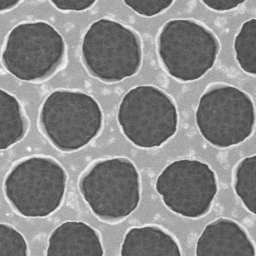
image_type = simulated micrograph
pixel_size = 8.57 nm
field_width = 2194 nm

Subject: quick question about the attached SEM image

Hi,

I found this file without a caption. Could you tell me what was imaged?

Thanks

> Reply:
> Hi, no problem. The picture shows a regular array of holes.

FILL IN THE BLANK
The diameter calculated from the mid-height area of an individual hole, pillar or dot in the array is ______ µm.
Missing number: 0.511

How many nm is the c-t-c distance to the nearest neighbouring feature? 644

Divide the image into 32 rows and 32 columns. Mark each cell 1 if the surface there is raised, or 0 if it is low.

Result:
00111110000011110000011111000011
11111111111111111000111111111111
11111111111111111111110111111110
11000001111000001111000001111100
10000000111000000111000000011100
10000000110000000011000000011000
10000000110000000011000000011000
00000000110000000011000000011100
10000001111000000111100000111100
11000011111100001111110001111111
11111111111111111111111111111111
01111110011111110000111111000011
00111100000011100000011110000001
00111000000011100000001110000000
00011000000001100000001110000000
00011000000001100000001110000000
00011100000011110000001110000001
00111100000111110000011111000011
01111110001111111111111111111111
11111111111111111111111111111111
11000001111100000111100000111100
10000000111000000111000000011100
10000000110000000111000000011100
10000000110000000111000000011000
10000000110000000111000000011100
11000001111000000111100000111110
11100011111100001111110000111111
11111111111110111111111111100111
00111110000111111100111111000011
00011100000011110000011110000001
00011100000001100000001110000001
00011100000001100000001110000000